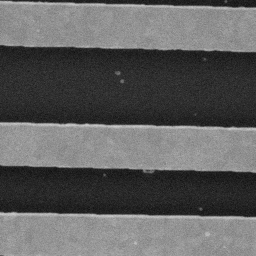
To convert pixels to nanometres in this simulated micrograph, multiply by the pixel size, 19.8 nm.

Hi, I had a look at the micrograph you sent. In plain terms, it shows lines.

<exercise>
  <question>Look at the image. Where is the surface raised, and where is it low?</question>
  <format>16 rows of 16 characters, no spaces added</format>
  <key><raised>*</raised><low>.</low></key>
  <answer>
***************.
****************
****************
................
................
................
................
................
****************
****************
........********
................
................
*********.......
****************
****************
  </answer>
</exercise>